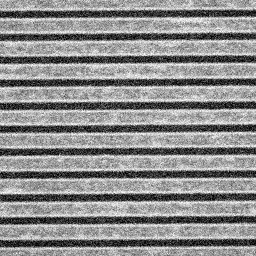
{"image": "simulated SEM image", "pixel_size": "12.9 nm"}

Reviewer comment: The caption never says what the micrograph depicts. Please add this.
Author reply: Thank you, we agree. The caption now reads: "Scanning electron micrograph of parallel lines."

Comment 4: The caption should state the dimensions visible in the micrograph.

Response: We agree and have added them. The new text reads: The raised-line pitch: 295 nanometres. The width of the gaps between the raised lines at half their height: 9.62 px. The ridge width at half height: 168 nanometres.